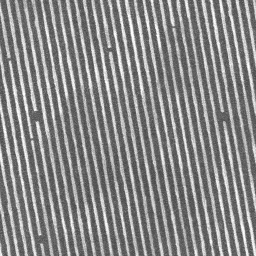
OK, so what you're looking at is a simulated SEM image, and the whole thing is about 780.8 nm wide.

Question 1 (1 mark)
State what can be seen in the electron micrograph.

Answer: parallel lines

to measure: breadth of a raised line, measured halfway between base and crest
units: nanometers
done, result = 8.6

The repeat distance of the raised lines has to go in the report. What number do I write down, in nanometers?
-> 25.6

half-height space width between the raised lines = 17.3 nm